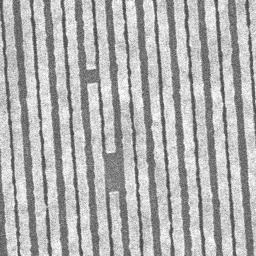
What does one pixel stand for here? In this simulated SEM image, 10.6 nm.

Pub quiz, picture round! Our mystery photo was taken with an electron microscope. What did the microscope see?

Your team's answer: parallel lines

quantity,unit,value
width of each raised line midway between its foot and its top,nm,103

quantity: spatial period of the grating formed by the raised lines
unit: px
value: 15.4